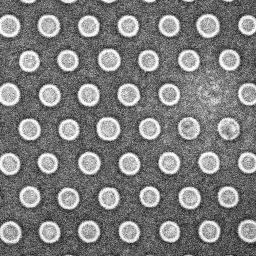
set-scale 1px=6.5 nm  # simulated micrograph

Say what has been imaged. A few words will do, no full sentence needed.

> a regular array of raised bodies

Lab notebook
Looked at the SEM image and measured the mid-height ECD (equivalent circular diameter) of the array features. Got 128 nm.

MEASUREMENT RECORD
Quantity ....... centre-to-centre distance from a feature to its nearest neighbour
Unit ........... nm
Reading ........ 254